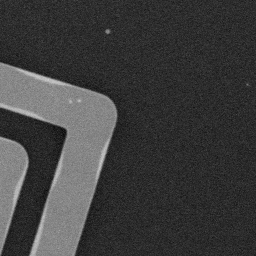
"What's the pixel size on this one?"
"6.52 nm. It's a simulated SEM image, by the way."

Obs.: groups of lines, slits or small figures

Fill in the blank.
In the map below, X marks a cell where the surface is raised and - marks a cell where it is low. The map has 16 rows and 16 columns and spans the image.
----------------
----------------
----------------
----------------
XX--------------
XXXXX-----------
XXXXXXX---------
---XXXX---------
----XXX---------
XX--XXX---------
XX--XX----------
X--XXX----------
X--XXX----------
X--XX-----------
--XXX-----------
--XXX-----------